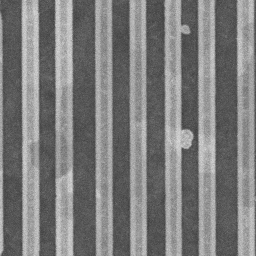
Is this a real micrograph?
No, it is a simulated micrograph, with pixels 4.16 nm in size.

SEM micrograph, parallel lines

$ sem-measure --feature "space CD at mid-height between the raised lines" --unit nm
93.1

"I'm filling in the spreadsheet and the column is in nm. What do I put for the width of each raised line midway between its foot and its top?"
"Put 52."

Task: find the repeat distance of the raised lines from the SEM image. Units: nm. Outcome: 149